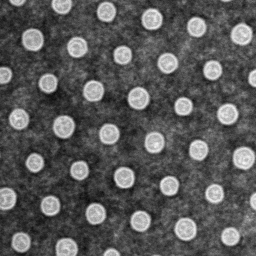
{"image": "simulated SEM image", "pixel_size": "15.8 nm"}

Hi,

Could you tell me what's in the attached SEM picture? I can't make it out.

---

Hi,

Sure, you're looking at a regular array of raised bodies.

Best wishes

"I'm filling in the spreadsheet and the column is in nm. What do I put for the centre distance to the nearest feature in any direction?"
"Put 719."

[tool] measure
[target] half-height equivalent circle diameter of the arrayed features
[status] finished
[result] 302 nanometers